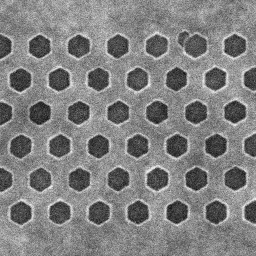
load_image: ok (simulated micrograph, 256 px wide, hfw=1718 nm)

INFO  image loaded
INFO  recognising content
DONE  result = a regular array of holes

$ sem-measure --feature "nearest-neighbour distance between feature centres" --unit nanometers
257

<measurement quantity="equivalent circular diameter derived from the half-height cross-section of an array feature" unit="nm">154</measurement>